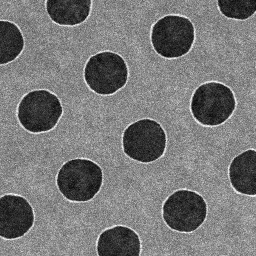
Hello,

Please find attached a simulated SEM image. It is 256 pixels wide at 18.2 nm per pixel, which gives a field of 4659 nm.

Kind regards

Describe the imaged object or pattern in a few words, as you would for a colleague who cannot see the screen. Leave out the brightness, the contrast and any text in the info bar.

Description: holes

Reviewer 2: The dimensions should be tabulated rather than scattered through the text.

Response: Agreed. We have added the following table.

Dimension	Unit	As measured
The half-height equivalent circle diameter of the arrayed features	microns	0.793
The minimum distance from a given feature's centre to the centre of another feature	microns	1.39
